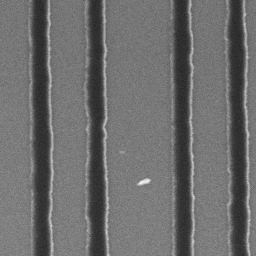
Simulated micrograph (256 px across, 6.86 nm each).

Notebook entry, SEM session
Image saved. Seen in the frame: lines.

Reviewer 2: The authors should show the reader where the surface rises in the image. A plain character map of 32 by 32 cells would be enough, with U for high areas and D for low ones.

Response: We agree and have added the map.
DDDDUUDDDDDUUDDDDDDDDUUUDDDDUUUD
DDDDUUDDDDDUUDDDDDDDDDUUDDDDUUUD
DDDDUUDDDDDUUDDDDDDDDUUUDDDDUUUD
DDDDUUDDDDDUUDDDDDDDDUUUDDDDUUUD
DDDDUUDDDDDUUDDDDDDDDUUUDDDDUUUD
DDDDUUDDDDDUUDDDDDDDDUUUDDDDUUUD
DDDDUUDDDDDUUDDDDDDDDUUUDDDDUUUD
DDDDUUDDDDDUUDDDDDDDDUUUDDDDUUUD
DDDDUUDDDDDUUDDDDDDDDUUUDDDDUUUD
DDDDUUDDDDDUUDDDDDDDDUUUDDDDUUUD
DDDDUUDDDDDUUDDDDDDDDDUUDDDDUUUD
DDDDUUDDDDDUUDDDDDDDDDUUDDDDUUUD
DDDDUUDDDDDUUDDDDDDDDDUUDDDDUUUD
DDDDUUDDDDDUUDDDDDDDDDUUDDDDUUUD
DDDDUUDDDDDUUDDDDDDDDDUUDDDDUUUD
DDDDUUDDDDDUUDDDDDDDDDUUDDDDUUUD
DDDDUUUDDDDUUDDDDDDDDDUUDDDDUUUD
DDDDUUUDDDDUUDDDDDDDDDUUDDDDUUUD
DDDDUUUDDDDUUDDDDDDDDDUUDDDDUUUD
DDDDUUDDDDDUUDDDDDDDDDUUDDDDDUUD
DDDDUUUDDDDUUDDDDDDDDDUUDDDDDUUD
DDDDUUUDDDDUUDDDDDDDDDUUDDDDDUUD
DDDDUUUDDDDUUDDDDDDDDDUUDDDDDUUD
DDDDUUDDDDDUUDDDDDDDDDUUDDDDDUUD
DDDDUUDDDDDUUUDDDDDDDDUUDDDDDUUD
DDDDUUDDDDDUUUDDDDDDDDUUDDDDDUUD
DDDDUUDDDDDUUUDDDDDDDDUUDDDDUUUD
DDDDUUDDDDDUUDDDDDDDDDUUDDDDDUUD
DDDDUUDDDDDUUDDDDDDDDDUUDDDDDUUD
DDDDUUDDDDDUUDDDDDDDDDUUDDDDDUUD
DDDDUUUDDDDUUUDDDDDDDDUUDDDDDUUD
DDDDUUUDDDDUUUDDDDDDDDUUDDDDDUUD